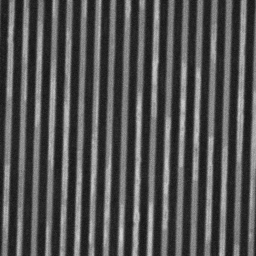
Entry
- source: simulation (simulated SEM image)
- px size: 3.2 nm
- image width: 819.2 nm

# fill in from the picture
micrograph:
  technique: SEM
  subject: parallel lines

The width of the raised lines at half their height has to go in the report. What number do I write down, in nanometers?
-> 17.2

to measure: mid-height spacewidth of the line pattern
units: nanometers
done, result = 28.7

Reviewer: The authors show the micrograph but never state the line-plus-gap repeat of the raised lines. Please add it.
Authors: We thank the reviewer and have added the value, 0.0463 microns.